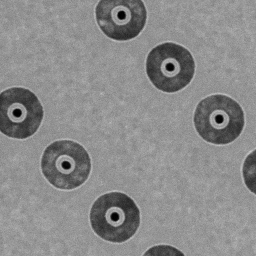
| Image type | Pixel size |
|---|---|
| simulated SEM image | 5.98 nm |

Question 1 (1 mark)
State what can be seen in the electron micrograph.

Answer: ring-shaped grooves with a dot in the middle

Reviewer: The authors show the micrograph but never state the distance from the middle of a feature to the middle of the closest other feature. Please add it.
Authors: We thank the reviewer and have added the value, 428 nm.